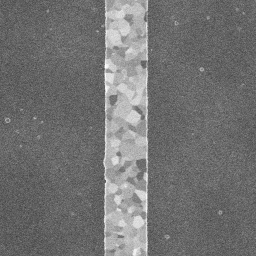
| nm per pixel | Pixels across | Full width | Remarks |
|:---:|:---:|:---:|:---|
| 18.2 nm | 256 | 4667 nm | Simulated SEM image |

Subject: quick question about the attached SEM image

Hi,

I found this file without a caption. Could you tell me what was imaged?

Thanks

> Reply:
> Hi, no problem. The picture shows one or a few lines or trenches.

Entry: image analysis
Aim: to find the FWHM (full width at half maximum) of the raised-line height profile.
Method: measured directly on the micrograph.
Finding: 757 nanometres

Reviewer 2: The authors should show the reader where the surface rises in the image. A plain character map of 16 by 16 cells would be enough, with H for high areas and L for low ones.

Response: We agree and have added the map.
LLLLLLLHHLLLLLLL
LLLLLLLHHLLLLLLL
LLLLLLLHHLLLLLLL
LLLLLLLHHLLLLLLL
LLLLLLLHHLLLLLLL
LLLLLLLHHLLLLLLL
LLLLLLLHHLLLLLLL
LLLLLLLHHLLLLLLL
LLLLLLLHHLLLLLLL
LLLLLLLHHLLLLLLL
LLLLLLLHHLLLLLLL
LLLLLLLHHLLLLLLL
LLLLLLLHHLLLLLLL
LLLLLLLHHLLLLLLL
LLLLLLLHHLLLLLLL
LLLLLLLHHLLLLLLL